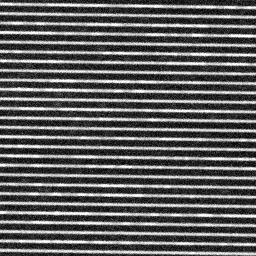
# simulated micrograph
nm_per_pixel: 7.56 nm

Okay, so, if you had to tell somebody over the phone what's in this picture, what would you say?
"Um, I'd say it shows parallel lines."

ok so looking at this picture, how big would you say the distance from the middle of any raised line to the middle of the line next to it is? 0.0716 microns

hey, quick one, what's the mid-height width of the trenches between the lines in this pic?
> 54.8 nm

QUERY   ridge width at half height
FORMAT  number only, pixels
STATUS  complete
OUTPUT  2